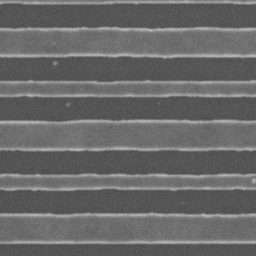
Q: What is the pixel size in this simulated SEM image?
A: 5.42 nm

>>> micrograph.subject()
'lines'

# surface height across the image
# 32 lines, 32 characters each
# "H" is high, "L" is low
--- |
LLLLLLLLLLLLLLLLLLLLLLLLLLLLLLLL
LLLLLLLLLLLLLLLLLLLLLLLLLLLLLLLL
LLLLLLLLLLLLLLLLLLLLLLLLLLLLLLLL
LLLLLLLLLLHLHHLLLLLLLLLLLHLLLLLL
HHHHHHHHHHHHHHHHHHHHHHHHHHHHHHHH
HHHHHHHHHHHHHHHHHHHHHHHHHHHHHHHH
HHHHHHHHHHHHHHHHHHHHHHHHHHHHHHHH
LLLLLLLLLLLLLLLLLLLLLLLLLLLLLLLL
LLLLLLLLLLLLLLLLLLLLLLLLLLLLLLLL
LLLLLLLLLLLLLLLLLLLLLLLLLLLLLLLL
HHHHHHHHHHHHHHHHHHHHHHHHHHHHHHHH
HHHHHHHHHHHHHHHHHHHHHHHHHHHHHHHH
LLLLLLLLLLLLLLLLLLLLLLLLLLLLLLLL
LLLLLLLLLLLLLLLLLLLLLLLLLLLLLLLL
LLLLLLLLLLLLLLLLLLLLLLLLLLLLLLLL
HHHHHHHHHHHHHHHHHHHHHHHHHHHHHHHH
HHHHHHHHHHHHHHHHHHHHHHHHHHHHHHHH
HHHHHHHHHHHHHHHHHHHHHHHHHHHHHHHH
HHHHHHHHHHHHHHHHHHHHHHHHHHHHHHHH
LLLLLLLLLLLLLLLLLLLLLLLLLLLLLLLL
LLLLLLLLLLLLLLLLLLLLLLLLLLLLLLLL
LLLLLLLLLLLLLLLLLLLLLLLLLLLLLLLL
HHHHHHHHHHHHHHHHHHHHHHHHHHHHHHHH
HHHHHHHHHHHHHHHHHHHHHHHHHHHHHHHH
LLLLLLLLLLLLLLLLLLLLLLLLLLLLLLLL
LLLLLLLLLLLLLLLLLLLLLLLLLLLLLLLL
LLLLLLLLLLLLLLLLLLLLLLLLLLLLLLLL
HHHHHHHHHHHHHHHHHHHHHHHHHHHHHHHH
HHHHHHHHHHHHHHHHHHHHHHHHHHHHHHHH
HHHHHHHHHHHHHHHHHHHHHHHHHHHHHHHH
LLLLLLLLLLLLLLLLLLLLLLLLLLLLLLLL
LLLLLLLLLLLLLLLLLLLLLLLLLLLLLLLL